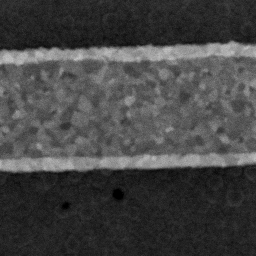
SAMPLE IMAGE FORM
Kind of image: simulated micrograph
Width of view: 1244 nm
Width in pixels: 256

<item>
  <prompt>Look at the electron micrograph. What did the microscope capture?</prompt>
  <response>one or a few lines or trenches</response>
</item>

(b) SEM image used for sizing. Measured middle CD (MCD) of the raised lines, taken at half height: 529 nm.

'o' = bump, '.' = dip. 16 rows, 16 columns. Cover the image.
................
................
................
..oooooooooooooo
oooooooooooooooo
oooooooooooooooo
oooooooooooooooo
oooooooooooooooo
oooooooooooooooo
oooooooooooooooo
................
................
................
................
................
................